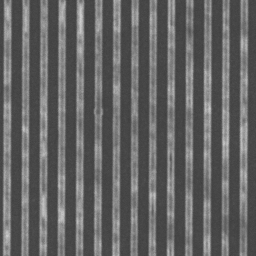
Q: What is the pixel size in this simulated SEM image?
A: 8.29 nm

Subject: parallel lines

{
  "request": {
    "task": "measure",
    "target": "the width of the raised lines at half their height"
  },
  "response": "48.7 nm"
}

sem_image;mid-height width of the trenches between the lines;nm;98.5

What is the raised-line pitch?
151 nm